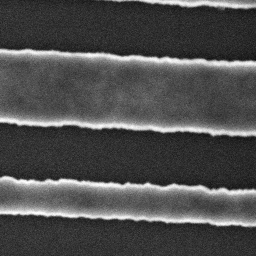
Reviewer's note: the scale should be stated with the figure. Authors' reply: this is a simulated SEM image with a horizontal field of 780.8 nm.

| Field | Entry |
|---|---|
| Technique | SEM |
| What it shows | lines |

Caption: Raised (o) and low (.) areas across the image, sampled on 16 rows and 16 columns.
................
................
................
ooooooo.........
oooooooooooooooo
oooooooooooooooo
oooooooooooooooo
oooooooooooooooo
................
................
................
ooooooo.........
oooooooooooooooo
....oooooooooooo
................
................